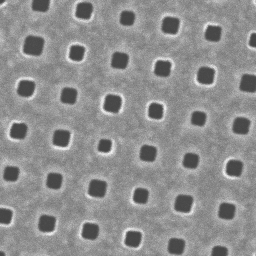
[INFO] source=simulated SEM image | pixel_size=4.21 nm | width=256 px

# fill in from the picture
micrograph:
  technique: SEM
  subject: a regular array of holes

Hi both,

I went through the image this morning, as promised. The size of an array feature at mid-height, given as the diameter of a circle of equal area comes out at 17.3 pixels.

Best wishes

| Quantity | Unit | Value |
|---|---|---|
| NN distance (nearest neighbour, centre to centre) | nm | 182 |